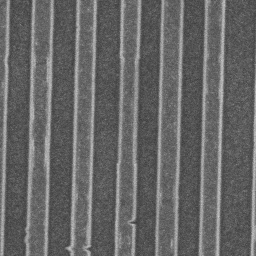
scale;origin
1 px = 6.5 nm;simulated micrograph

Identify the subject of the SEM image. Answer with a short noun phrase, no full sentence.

parallel lines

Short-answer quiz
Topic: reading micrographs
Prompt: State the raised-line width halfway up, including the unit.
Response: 0.117 µm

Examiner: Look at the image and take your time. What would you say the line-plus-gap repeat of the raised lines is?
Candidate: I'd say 280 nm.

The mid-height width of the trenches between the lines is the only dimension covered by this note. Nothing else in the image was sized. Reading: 0.16 microns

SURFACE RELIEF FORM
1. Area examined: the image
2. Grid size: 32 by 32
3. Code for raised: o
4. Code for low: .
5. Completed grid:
o...oo....oo...oo...ooo...oo....
o...oo....oo...oo...ooo...oo....
o...oo....oo...oo...ooo...oo....
o...oo....oo...oo...ooo...oo....
o...oo....oo...oo...ooo...oo....
o...oo....oo...oo...ooo...oo....
o...oo....oo...oo...ooo...oo....
o...oo....oo...oo...ooo...oo....
o...oo....oo...oo...oo....oo....
o...oo....oo...oo...ooo...oo....
o...oo....oo...oo...ooo...oo....
o...oo...ooo...oo...oo....oo....
o...oo...ooo...oo...oo....oo....
o...oo...ooo...oo...oo....oo....
o...oo...ooo...oo...oo...ooo....
o...oo...ooo...oo...oo...ooo....
o...oo...ooo...oo...oo...ooo....
o...oo...oo....oo...oo...ooo....
o...oo...oo....oo...oo...ooo....
o...oo...oo....oo...oo...ooo....
o...oo...oo....oo...oo...oo.....
o...oo...oo....oo...oo...oo.....
....oo...oo....oo...oo...oo.....
....oo...oo....oo...oo...oo.....
....oo...oo....oo...oo...oo.....
....oo...oo....oo...oo...oo.....
....oo...oo....oo...oo...oo.....
....oo...oo....oo...oo...oo.....
...ooo...oo....oo...oo...oo.....
...ooo...oo....oo...oo...oo.....
...ooo...oo....oo...oo...oo.....
...ooo...oo....oo...oo...oo.....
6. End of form